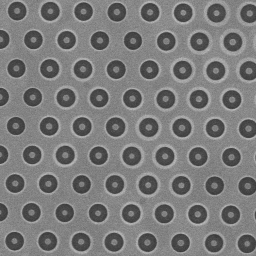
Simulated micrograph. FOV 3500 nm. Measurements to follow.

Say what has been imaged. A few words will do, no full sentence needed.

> an array of small figures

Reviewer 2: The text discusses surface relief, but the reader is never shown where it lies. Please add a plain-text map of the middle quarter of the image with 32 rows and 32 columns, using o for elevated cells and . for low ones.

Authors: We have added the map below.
oo.....oooo....oooo.....ooo.....
oo.....ooo......ooo..o..ooo.....
oo.....oooo....oooo.....ooo.....
ooo...oooooo..oooooo...ooooo....
oooooooooooooooooooooooooooooooo
oooooooooooooooooooooooooooooooo
..ooooo...oooooo..oooooo...ooooo
...ooo.....oooo....oooo.....ooo.
...ooo.....ooo......ooo.....ooo.
...ooo.....oooo.....ooo.....ooo.
..ooooo...ooooo....oooo....ooooo
ooooooooooooooooooooooooo.oooooo
oooooooooooooooooooooooooooooooo
ooo...oooooo..oooooo...ooooo...o
oo.....oooo....oooo.....ooo.....
oo.....ooo......oo......ooo.....
oo.....ooo......oo......ooo.....
ooo...ooooo....oooo....oooo.....
oooooooooooooooooooo..ooooooo.oo
oooooooooooooooooooooooooooooooo
..oooooo.ooooooo..oooooo..oooooo
...oooo....oooo....oooo....ooooo
...ooo..o..ooo......ooo.....ooo.
...ooo..o..ooo......ooo.....ooo.
..ooooo....oooo....oooo.....ooo.
oooooooooooooooo..oooooo..oooooo
oooooooooooooooooooooooooooooooo
oooooooooooo.ooooooooooooooooooo
ooo...ooooo....oooo....oooo....o
oo.....ooo.....ooo......ooo.....
oo.....ooo.....ooo......ooo.....
ooo...ooooo....oooo....oooo.....